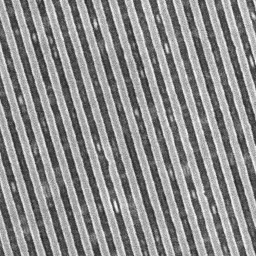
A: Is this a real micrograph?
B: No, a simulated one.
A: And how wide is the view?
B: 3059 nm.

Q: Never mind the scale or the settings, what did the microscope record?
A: parallel lines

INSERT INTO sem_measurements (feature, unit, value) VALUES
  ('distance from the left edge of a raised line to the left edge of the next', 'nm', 185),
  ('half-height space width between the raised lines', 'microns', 0.103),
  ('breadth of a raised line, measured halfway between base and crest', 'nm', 90.4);